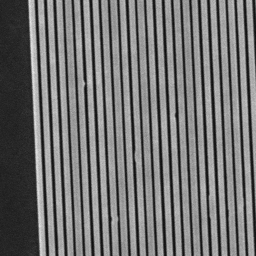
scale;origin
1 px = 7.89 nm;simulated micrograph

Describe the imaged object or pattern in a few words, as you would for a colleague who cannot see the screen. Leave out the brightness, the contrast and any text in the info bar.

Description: parallel lines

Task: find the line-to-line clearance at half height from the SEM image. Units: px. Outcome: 3.24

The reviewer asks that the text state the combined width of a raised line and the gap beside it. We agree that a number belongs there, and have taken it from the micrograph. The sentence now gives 71.4 nanometers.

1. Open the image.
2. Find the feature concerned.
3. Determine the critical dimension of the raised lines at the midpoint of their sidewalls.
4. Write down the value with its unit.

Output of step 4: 0.0463 µm